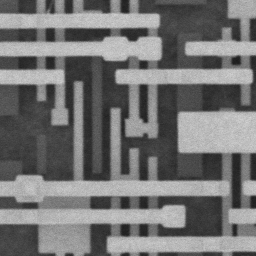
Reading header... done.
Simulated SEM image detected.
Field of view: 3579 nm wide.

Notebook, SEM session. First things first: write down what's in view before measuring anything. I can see wiring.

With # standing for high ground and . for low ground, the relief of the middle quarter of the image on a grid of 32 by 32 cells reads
................................
................................
.............###################
.............###################
.............###################
................................
................................
................................
................................
................................
................................
................................
.............................###
.............................###
.............................###
.............................###
.............................###
.............................###
.............................###
.............................###
.............................###
.............................###
................................
................................
................................
................................
................................
................................
................................
....##......#########....#######
################################
################################